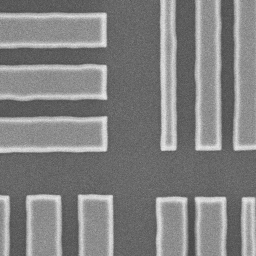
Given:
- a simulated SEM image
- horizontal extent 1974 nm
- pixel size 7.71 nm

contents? groups of lines, slits or small figures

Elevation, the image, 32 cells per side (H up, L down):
LLLLLLLLLLLLLLLLLLLLHHLLLHHLLHHH
LLLLLLLLLLLLLLLLLLLLHHLLLHHLLHHH
HHHHHHHHHHHHHLLLLLLLHHLLLHHLLHHH
HHHHHHHHHHHHHLLLLLLLHHLLLHHLLHHH
HHHHHHHHHHHHHLLLLLLLHHLLLHHLLHHH
HHHHHHHHHHHHHLLLLLLLHHLLLHHLLHHH
LLLLLLLLLLLLLLLLLLLLHHLLLHHLLHHH
LLLLLLLLLLLLLLLLLLLLHHLLLHHLLHHH
HHHHHHHHHHHHHLLLLLLLHHLLLHHLLHHH
HHHHHHHHHHHHHLLLLLLLHHLLLHHLLHHH
HHHHHHHHHHHHHLLLLLLLHHLLLHHLLHHH
HHHHHHHHHHHHHLLLLLLLHHLLLHHLLHHH
LLLLLLLLLLLLLLLLLLLLHHLLLHHLLHHH
LLLLLLLLLLLLLLLLLLLLHHLLLHHLLHHH
LLLLLLLLLLLLLLLLLLLLHHLLLHHLLHHH
HHHHHHHHHHHHHLLLLLLLHHLLLHHLLHHH
HHHHHHHHHHHHHLLLLLLLHHLLLHHLLHHH
HHHHHHHHHHHHHLLLLLLLHHLLLHHLLHHH
HHHHHHHHHHHHHLLLLLLLLHLLLHHLLLHL
LLLLLLLLLLLLLLLLLLLLLLLLLLLLLLLL
LLLLLLLLLLLLLLLLLLLLLLLLLLLLLLLL
LLLLLLLLLLLLLLLLLLLLLLLLLLLLLLLL
LLLLLLLLLLLLLLLLLLLLLLLLLLLLLLLL
LLLLLLLLLLLLLLLLLLLLLLLLLLLLLLLL
LLLLLLLLLLLLLLLLLLLLLLLLLLLLLLLL
HLLHHHHLLLHHHHLLLLLLHHHLLHHHLLHH
HLLHHHHLLLHHHHLLLLLLHHHLLHHHLLHH
HLLHHHHLLLHHHHLLLLLLHHHLLHHHLLHH
HLLHHHHLLLHHHHLLLLLLHHHLLHHHLLHH
HLLLHHHLLLHHHHLLLLLLHHHLLHHHLLHH
HLLHHHHLLLHHHHLLLLLLHHHLLHHHLLHH
HLLHHHHLLLHHHHLLLLLLHHHLLHHHLLHH